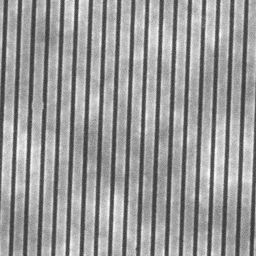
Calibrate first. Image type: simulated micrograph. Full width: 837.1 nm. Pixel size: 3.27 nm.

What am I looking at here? parallel lines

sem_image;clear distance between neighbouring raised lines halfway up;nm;16.7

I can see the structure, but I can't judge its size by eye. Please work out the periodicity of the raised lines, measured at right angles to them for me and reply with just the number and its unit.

46.3 nanometers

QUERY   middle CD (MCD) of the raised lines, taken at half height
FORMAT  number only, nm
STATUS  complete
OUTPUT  31